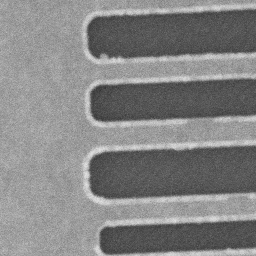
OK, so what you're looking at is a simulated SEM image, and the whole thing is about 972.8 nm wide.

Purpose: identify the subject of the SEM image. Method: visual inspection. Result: one or a few lines or trenches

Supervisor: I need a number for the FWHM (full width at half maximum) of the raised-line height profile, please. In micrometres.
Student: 0.0983